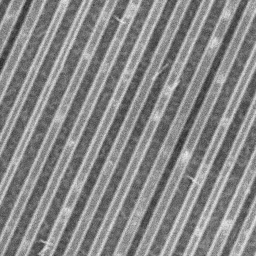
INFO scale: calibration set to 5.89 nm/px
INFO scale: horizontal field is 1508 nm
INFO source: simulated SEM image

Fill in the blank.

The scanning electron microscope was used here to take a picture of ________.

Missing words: parallel lines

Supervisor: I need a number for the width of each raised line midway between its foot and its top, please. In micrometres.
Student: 0.0504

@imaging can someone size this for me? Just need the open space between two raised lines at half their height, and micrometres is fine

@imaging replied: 0.078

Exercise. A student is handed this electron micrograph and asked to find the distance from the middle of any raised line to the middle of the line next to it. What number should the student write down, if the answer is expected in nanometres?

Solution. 128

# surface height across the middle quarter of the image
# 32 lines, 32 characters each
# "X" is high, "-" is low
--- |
----XX---XXX----XX----XX----XX--
---XX----XX----XXX---XXX---XX---
---XX----XX----XX----XXX---XX---
--XX----XX----XXX---XXX---XX----
--XX----XX----XX----XX----XX----
-XXX---XXX---XXX---XXX---XXX---X
-XX----XX----XX----XX----XX----X
XXX---XXX----XX---XXX---XXX----X
XX----XX----XX----XX----XX----XX
XX---XXX----XX---XXX---XXX----XX
X----XX----XXX---XXX---XX----XXX
X----XX----XX---XXX----XX----XXX
----XX----XXX---XXX---XX----XXX-
----XX----XX----XX----XX----XXX-
---XXX---XXX---XXX---XX----XXX--
---XX----XX----XX----XX----XXX--
--XXX----XX---XXX---XXX----XX---
--XX----XX----XX----XX----XXX---
-XXX----XX---XXX---XXX----XX---X
-XX----XXX---XX----XX----XXX---X
XXX----XX---XXX----XX----XXX--XX
XX----XXX---XXX---XX----XXX---XX
XX----XX---XXX----XX----XXX--XXX
X----XXX---XXX---XXX---XXX---XX-
X----XX----XX----XX----XXX--XXX-
X----XX---XXX---XXX----XX---XX--
----XX----XX----XX----XXX---XX--
----XX---XXX---XXX----XX---XXX--
---XX----XX----XX----XXX---XX---
---XX---XXX---XXX----XX---XXX---
--XXX---XXX---XX----XXX---XX----
--XX---XXX----XX----XXX--XXX----